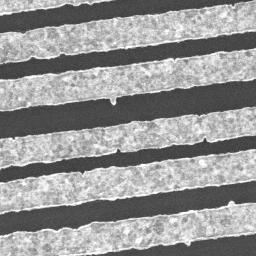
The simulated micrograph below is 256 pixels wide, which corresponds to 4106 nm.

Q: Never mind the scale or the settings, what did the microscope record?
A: parallel lines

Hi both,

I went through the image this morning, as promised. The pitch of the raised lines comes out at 801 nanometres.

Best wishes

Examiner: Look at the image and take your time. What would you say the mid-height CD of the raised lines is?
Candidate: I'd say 457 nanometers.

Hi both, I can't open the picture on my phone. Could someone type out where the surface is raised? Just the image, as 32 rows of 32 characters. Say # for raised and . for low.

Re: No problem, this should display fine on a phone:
########.#....................##
##...................###########
.............###################
.....###########################
##########################......
###################.............
###########..................###
###...................##########
..............##################
.....###########################
##########################......
###################.............
###########.....................
##.............................#
.......................#########
................################
........########################
#########################.#.....
##################..............
##########................######
###................#############
...........#####################
...############################.
#######################.........
################................
#########......................#
........................########
................################
..........######################
.###########################....
###################.............
#############...................